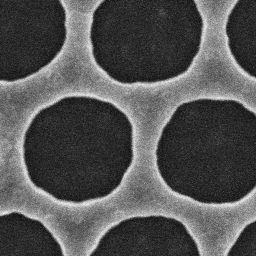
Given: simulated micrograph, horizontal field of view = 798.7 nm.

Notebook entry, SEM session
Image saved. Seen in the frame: holes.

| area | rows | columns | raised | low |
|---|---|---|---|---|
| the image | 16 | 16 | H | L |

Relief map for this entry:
LLLLHHLLLLLLHHHL
LLLLHHLLLLLLLHLL
LLLLHHLLLLLLLHLL
LLLLHHLLLLLLHHHL
LLHHHHHLLLLLHHHL
HHHHHHHHHHHHHHHH
HHHLLLLHHHHLLLLH
HHLLLLLLHHHLLLLL
HHLLLLLLHHLLLLLL
HLLLLLLLHHLLLLLL
HHLLLLLLHHLLLLLL
HHLLLLLHHHLLLLLL
HHHHLLHHHHHHLLLH
LLHHHHHHHLHHHHHH
LLLHHHHLLLLLHHHL
LLLLHHLLLLLLHHLL